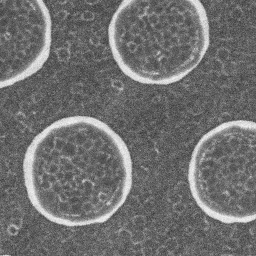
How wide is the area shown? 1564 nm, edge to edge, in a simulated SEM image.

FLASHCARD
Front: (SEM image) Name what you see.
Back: raised bodies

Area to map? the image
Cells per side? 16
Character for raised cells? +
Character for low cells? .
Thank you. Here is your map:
+++.....++++....
+++....++++++...
+++....++++++...
+++....++++++...
++......++++....
................
................
....++..........
..+++++......+++
..++++++....++++
..++++++....++++
..++++++....++++
..++++++....++++
...++++......+++
................
................